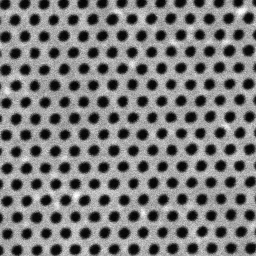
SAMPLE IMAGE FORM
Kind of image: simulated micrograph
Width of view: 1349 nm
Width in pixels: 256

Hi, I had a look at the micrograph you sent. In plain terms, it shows a regular array of holes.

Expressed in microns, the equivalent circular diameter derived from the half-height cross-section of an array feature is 0.0604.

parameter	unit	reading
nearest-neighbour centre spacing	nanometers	98.4